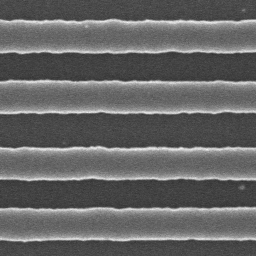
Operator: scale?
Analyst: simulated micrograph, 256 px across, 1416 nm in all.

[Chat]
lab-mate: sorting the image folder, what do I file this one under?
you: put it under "lines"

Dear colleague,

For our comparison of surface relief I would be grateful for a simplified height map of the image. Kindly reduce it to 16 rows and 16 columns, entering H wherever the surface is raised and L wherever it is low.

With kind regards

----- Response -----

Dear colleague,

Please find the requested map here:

LLLLLLLLLLLLLLLL
HHHHHHHHHHHHHHHH
HHHHHHHHHHHHHHHH
LLLLLLLLLLLLLLLL
LLLLLLLLLLLLLLLL
HHHHHHHHHHHHHHHH
HHHHHHHHHHHHHHHH
LLLLLLLLLLLLLLLL
LLLLLLLLLLLLLLLL
HHHHHHHHHHHHHHHH
HHHHHHHHHHHHHHHH
LLLLLLLLLLLLLLLL
LLLLLLLLLLLLLLLL
HHHHHHHHHHHHHHHH
HHHHHHHHHHHHHHHH
LLLLLLLLLLLLLLLL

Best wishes